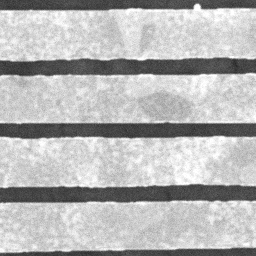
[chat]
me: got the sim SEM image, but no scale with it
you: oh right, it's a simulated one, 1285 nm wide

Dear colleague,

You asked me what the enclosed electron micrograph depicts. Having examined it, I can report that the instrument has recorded lines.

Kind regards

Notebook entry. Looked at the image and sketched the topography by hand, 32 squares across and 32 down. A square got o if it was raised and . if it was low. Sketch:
................................
oooooooooooooooooooooooooooooooo
oooooooooooooooooooooooooooooooo
oooooooooooooooooooooooooooooooo
oooooooooooooooooooooooooooooooo
oooooooooooooooooooooooooooooooo
oooooooooooooooooooooooooooooooo
.oooo...........................
................................
ooo.oooooooooooooooooooooooooooo
oooooooooooooooooooooooooooooooo
oooooooooooooooooooooooooooooooo
oooooooooooooooooooooooooooooooo
oooooooooooooooooooooooooooooooo
oooooooooooooooooooooooooooooooo
................................
................................
oooooooooooooooooooooooooooooooo
oooooooooooooooooooooooooooooooo
oooooooooooooooooooooooooooooooo
oooooooooooooooooooooooooooooooo
oooooooooooooooooooooooooooooooo
oooooooooooooooooooooooooooooooo
................................
................................
oooooooooooooooooooooooooooooooo
oooooooooooooooooooooooooooooooo
oooooooooooooooooooooooooooooooo
oooooooooooooooooooooooooooooooo
oooooooooooooooooooooooooooooooo
oooooooooooooooooooooooooooooooo
................................